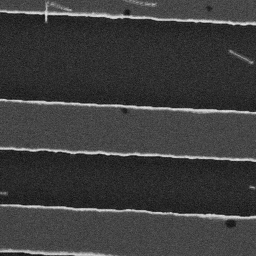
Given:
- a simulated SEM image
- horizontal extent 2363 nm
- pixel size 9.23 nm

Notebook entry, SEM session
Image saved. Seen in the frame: lines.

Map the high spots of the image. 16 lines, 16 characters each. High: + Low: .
++++++++++++++++
...............+
................
................
................
................
+++++...........
++++++++++++++++
++++++++++++++++
....++++++++++++
................
................
................
++++++++++++++..
++++++++++++++++
++++++++++++++++